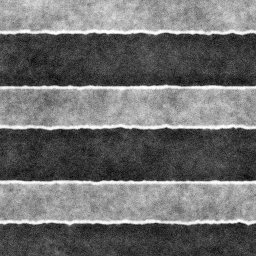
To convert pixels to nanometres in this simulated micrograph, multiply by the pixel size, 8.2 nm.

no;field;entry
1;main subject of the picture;lines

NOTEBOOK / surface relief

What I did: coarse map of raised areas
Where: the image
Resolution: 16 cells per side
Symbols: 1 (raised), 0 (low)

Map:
1111111111111111
1111111111111111
0000000000000000
0000000000000000
0000000000000000
1111111111111111
1111111111111111
1111111111111111
0000000000000000
0000000000000000
0000000000000000
1111111111111111
1111111111111111
1111111111111111
0000000000000000
0000000000000000